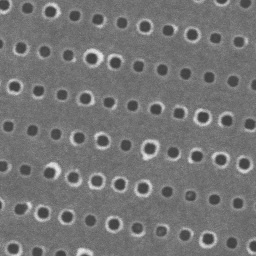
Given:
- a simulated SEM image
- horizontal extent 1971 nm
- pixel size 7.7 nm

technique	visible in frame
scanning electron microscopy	a regular array of holes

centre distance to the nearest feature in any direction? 0.182 um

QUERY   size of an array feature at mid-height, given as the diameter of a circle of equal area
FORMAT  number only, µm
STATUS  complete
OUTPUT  0.0919